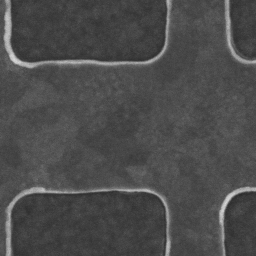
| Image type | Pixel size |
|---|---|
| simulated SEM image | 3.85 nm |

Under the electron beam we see holes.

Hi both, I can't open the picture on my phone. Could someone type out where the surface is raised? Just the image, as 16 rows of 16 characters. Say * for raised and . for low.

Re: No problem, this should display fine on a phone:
*.........****..
*.........****..
*.........****..
*.........*****.
****************
****************
****************
****************
****************
****************
****************
****************
*.........****..
*.........****..
*.........****..
*.........****..